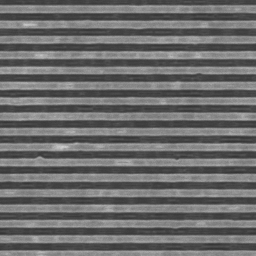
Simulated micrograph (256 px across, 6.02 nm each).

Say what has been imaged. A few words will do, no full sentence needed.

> parallel lines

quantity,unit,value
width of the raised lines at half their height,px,8.26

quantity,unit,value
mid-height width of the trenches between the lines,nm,44.4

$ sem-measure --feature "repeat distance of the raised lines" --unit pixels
15.3